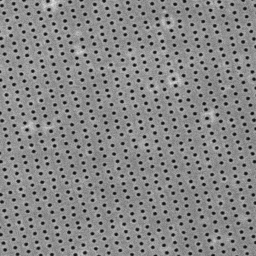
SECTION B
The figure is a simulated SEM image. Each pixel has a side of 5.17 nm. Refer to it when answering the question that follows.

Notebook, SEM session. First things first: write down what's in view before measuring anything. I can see a regular array of holes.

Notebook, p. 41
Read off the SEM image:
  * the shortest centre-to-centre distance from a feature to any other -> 38.3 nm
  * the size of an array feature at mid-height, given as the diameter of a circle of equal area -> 17.5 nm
